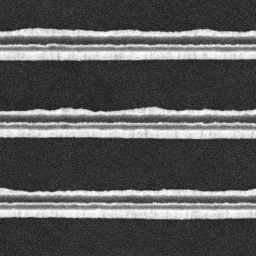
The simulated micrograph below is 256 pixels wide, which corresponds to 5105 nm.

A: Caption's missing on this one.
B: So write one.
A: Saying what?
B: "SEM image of lines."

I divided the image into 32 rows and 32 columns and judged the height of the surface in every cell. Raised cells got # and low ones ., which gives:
................................
................................
................................
................................
################################
################################
################################
................................
................................
................................
................................
................................
................................
................................
################################
################################
################################
................................
................................
................................
................................
................................
................................
................................
################################
################################
################################
................................
................................
................................
................................
................................